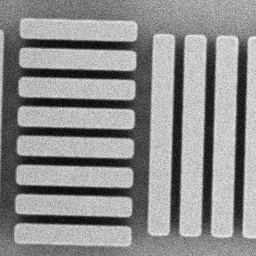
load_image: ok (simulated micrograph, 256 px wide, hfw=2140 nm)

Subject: groups of lines, slits or small figures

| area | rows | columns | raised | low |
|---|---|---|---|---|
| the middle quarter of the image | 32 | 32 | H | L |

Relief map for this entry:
HHHHHHHHHHHHHHHHHHLLLLHHHHHLLLHH
LLLLLLLLLLLLLLLHHLLLLLHHHHHLLLHH
LLLLLLLLLLLLLLLLLLLLLLHHHHHLLLHH
LLLLLLLLLLLLLLLLLLLLLLHHHHHLLLHH
HHHHHHHHHHHHHHHHHLLLLLHHHHHLLLHH
HHHHHHHHHHHHHHHHHHLLLLHHHHHLLLHH
HHHHHHHHHHHHHHHHHHLLLLHHHHHLLLHH
HHHHHHHHHHHHHHHHHHLLLLHHHHHLLLHH
LLLLLHHHHHHHHHHHHLLLLLHHHHHLLLHH
LLLLLLLLLLLLLLLLLLLLLLHHHHHLLLHH
LLLLLLLLLLLLLLLLLLLLLLHHHHHLLLHH
HHHHHHHHHHHHHHHHHLLLLLHHHHHLLLHH
HHHHHHHHHHHHHHHHHLLLLLHHHHHLLLHH
HHHHHHHHHHHHHHHHHLLLLLHHHHHLLLHH
HHHHHHHHHHHHHHHHHLLLLLHHHHHLLLHH
HHHHHHHHHHHHHHHHHLLLLLHHHHHLLLHH
LLLLLLLLLLLLLLLLLLLLLLHHHHHLLLHH
LLLLLLLLLLLLLLLLLLLLLLHHHHHLLLHH
HHHLLLLLLLLLLLLLLLLLLLHHHHHLLLHH
HHHHHHHHHHHHHHHHHLLLLLHHHHHLLLHH
HHHHHHHHHHHHHHHHHLLLLLHHHHHLLLHH
HHHHHHHHHHHHHHHHHLLLLLHHHHHLLLHH
HHHHHHHHHHHHHHHHHLLLLLHHHHHLLHHH
LLLLLLLLLLLLLLLLLLLLLLHHHHHLLHHH
LLLLLLLLLLLLLLLLLLLLLLHHHHHLLHHH
LLLLLLLLLLLLLLLLLLLLLLHHHHHLLHHH
HHHHHHHHHHHHHHHHHLLLLLHHHHHLLHHH
HHHHHHHHHHHHHHHHHLLLLLHHHHHLLHHH
HHHHHHHHHHHHHHHHHLLLLLHHHHHLLHHH
HHHHHHHHHHHHHHHHHLLLLLHHHHHLLHHH
LLLLLLLLHHHHHHHHHLLLLHHHHHLLLHHH
LLLLLLLLLLLLLLLLLLLLLHHHHHLLLHHH